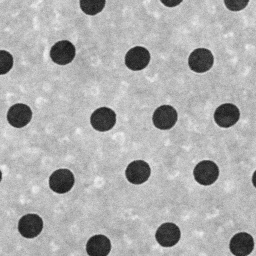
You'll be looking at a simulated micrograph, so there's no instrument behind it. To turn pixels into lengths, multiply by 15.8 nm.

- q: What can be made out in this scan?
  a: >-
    a regular array of holes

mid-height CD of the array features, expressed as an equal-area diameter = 25.8 pixels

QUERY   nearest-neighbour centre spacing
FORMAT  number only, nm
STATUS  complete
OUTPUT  960